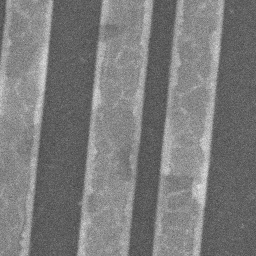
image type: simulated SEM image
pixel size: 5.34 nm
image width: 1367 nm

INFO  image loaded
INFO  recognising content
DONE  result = one or a few lines or trenches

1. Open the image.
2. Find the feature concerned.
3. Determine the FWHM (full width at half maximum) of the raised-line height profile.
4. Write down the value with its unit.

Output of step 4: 0.232 um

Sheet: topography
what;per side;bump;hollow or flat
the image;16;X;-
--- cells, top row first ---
XXX---XXX--XXX--
XXX---XXX--XXX--
XXX---XXX--XXX--
XXX---XXX--XXX--
XXX---XXX--XX---
XXX---XXX--XX---
XXX---XXX--XX---
XX----XXX-XXX---
XX----XXX-XXX---
XX----XXX-XXX---
XX---XXX--XXX---
XX---XXX--XXX---
XX---XXX--XXX---
XX---XXX--XXX---
XX---XXX--XXX---
XX---XXX--XX----